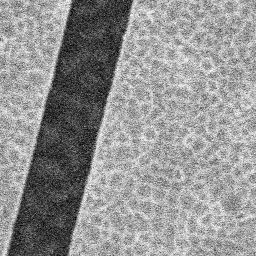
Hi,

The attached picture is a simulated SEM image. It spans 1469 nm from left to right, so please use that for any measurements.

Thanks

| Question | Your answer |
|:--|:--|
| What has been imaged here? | one or a few lines or trenches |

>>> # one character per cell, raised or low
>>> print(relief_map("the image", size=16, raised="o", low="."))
oooo....oooooooo
oooo....oooooooo
oooo....oooooooo
ooo.....oooooooo
ooo....ooooooooo
ooo....ooooooooo
ooo....ooooooooo
oo.....ooooooooo
oo....oooooooooo
oo....oooooooooo
oo....oooooooooo
o.....oooooooooo
o....ooooooooooo
o....ooooooooooo
o....ooooooooooo
....oooooooooooo